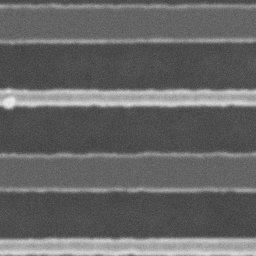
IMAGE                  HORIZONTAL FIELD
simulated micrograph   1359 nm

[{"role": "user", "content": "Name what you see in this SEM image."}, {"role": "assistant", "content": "lines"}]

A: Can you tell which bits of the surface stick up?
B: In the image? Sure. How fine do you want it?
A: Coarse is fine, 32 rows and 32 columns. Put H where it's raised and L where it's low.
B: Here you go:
LLLLLLLLLLLLLLLLLLLLLLLLLLLLLLLL
HHHHHHHHHHHHHHHHHHHHHHHHHHHHHHHH
HHHHHHHHHHHHHHHHHHHHHHHHHHHHHHHH
HHHHHHHHHHHHHHHHHHHHHHHHHHHHHHHH
HHHHHHHHHHHHHHHHHHHHHHHHHHHHHHHH
LLLLLLLLLLLLLLLLLLLLLLLLLLLLLLLL
LLLLLLLLLLLLLLLLLLLLLLLLLLLLLLLL
LLLLLLLLLLLLLLLLLLLLLLLLLLLLLLLL
LLLLLLLLLLLLLLLLLLLLLLLLLLLLLLLL
LLLLLLLLLLLLLLLLLLLLLLLLLLLLLLLL
LLLLLLLLLLLLLLLLLLLLLLLLLLLLLLLL
HHHHHHHHHHHHHHHHHHHHHHHHHHHHHHHH
HHHHHHHHHHHHHHHHHHHHHHHHHHHHHHHH
LLLLLLLLLLLLLLLLLLLLLLLLLLLLLLLL
LLLLLLLLLLLLLLLLLLLLLLLLLLLLLLLL
LLLLLLLLLLLLLLLLLLLLLLLLLLLLLLLL
LLLLLLLLLLLLLLLLLLLLLLLLLLLLLLLL
LLLLLLLLLLLLLLLLLLLLLLLLLLLLLLLL
LLLLLLLLLLLLLLLLLLLLLLLLLLLLLLLL
HHHHHHHHHHHHHHHHHHHHHHHHHHHHHHHH
HHHHHHHHHHHHHHHHHHHHHHHHHHHHHHHH
HHHHHHHHHHHHHHHHHHHHHHHHHHHHHHHH
HHHHHHHHHHHHHHHHHHHHHHHHHHHHHHHH
HHHHHHHHHHHHHHHHHHHHHHHHHHHHHHHH
LLLLLLLLLLLLLLLLLLLLLLLLLLLLLLLL
LLLLLLLLLLLLLLLLLLLLLLLLLLLLLLLL
LLLLLLLLLLLLLLLLLLLLLLLLLLLLLLLL
LLLLLLLLLLLLLLLLLLLLLLLLLLLLLLLL
LLLLLLLLLLLLLLLLLLLLLLLLLLLLLLLL
LLLLLLLLLLLLLLLLLLLLLLLLLLLLLLLL
HHHHHHHHHHHHHHHHHHHHHHHHHHHHHHHH
HHHHHHHHHHHHHHHHHHHHHHHHHHHHHHHH